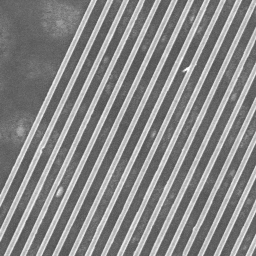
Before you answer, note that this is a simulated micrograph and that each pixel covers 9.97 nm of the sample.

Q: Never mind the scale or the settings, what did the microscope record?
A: parallel lines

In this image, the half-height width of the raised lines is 0.0463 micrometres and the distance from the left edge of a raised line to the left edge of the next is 0.145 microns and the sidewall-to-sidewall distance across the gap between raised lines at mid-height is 103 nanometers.